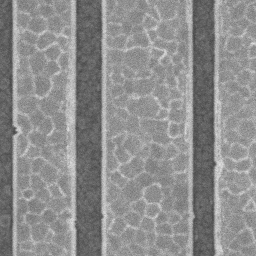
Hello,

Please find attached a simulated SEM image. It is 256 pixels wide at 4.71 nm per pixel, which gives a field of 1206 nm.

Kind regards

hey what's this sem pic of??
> one or a few lines or trenches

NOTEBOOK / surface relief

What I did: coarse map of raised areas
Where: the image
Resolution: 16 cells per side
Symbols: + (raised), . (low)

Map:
.++++..+++++..++
.++++..+++++..++
.++++..+++++..++
.++++..+++++..++
.++++..+++++..++
.++++..+++++..++
.++++..+++++..++
.++++..+++++.+++
.++++..+++++..++
.++++..+++++..++
.++++..+++++..++
.++++..+++++..++
.++++..+++++..++
.++++..+++++..++
.++++..+++++..++
.++++..+++++..++